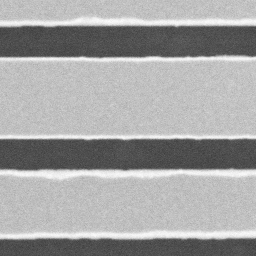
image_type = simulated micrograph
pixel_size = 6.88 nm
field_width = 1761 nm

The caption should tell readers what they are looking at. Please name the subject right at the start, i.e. lines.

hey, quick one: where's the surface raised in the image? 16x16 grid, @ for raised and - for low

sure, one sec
@@@@@@@@@@@@@@@@
@@@@@@@@@@@@@@@@
----------------
----------------
@@@@@@@@@@@@@@@@
@@@@@@@@@@@@@@@@
@@@@@@@@@@@@@@@@
@@@@@@@@@@@@@@@@
@@@@@@@@@@@@@@@@
----------------
----------------
@@@@@@@@@@@@@@@@
@@@@@@@@@@@@@@@@
@@@@@@@@@@@@@@@@
@@@@@@@@@@@@@@@@
----------------